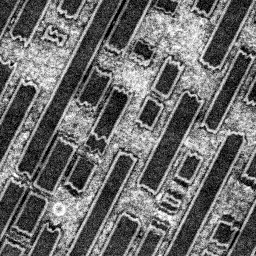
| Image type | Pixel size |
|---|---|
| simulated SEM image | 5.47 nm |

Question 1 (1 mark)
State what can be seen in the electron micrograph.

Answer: parallel lines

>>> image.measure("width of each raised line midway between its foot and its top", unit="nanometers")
104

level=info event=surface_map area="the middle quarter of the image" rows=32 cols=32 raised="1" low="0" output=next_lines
01111100000000000000000001111000
11111101100000000000000011111000
11111001111000000000000011111000
11111011111100000000000111110000
11110011111000000000000111110000
11100111111000000000001111100000
11100111110011100000000111100000
11001111110011110000000011000010
11001111100111111000010000000111
11001111100111110000111000000111
10000011001111110000111110001111
00000000001111100001111100001111
00000000011111000001111100011111
00000000011111000011111000011111
00000000111110000001111000111111
00000000111110000000110001111111
00000001111100000000000001111110
00000001111100000000000001111110
00000000111000000000000011111100
00000000001000000000000111111100
11000000000000000000000111111000
11100000000000000000001111111000
11000000000000100000001111110001
11001000000001111000001111110011
10011110000001111100011111100011
10011111000011111000011111100111
00111110000011111000111111000111
00111110000111110000111111001111
01111100000111110001111110000111
01111100001111100011111110000000
00111000001111100000111100000000
00011000011111000000011100000000